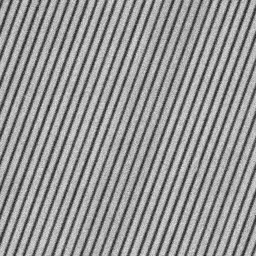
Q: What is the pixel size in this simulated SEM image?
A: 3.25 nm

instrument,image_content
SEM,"parallel lines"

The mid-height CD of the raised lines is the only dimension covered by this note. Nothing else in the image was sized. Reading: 18.7 nm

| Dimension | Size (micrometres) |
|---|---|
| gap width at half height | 0.0096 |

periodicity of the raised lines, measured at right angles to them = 29.1 nanometers